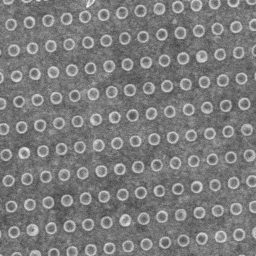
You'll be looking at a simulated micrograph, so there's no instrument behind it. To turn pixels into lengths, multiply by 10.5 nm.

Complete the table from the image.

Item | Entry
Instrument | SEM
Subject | a regular array of raised bodies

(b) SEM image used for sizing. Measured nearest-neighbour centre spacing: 195 nanometres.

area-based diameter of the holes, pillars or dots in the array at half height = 116 nm